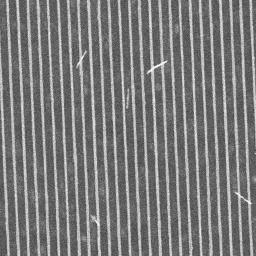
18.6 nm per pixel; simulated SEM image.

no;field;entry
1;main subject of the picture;parallel lines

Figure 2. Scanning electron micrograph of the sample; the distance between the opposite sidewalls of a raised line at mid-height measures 39.5 nm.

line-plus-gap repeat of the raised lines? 188 nm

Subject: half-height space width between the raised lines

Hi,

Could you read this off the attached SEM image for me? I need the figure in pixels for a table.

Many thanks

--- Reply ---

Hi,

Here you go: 7.87